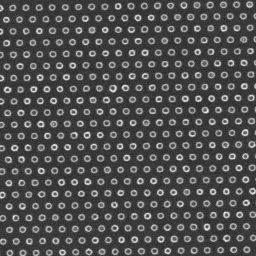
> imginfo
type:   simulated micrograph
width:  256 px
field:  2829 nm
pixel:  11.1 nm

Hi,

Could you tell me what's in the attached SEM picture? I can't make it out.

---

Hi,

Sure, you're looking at a regular array of raised bodies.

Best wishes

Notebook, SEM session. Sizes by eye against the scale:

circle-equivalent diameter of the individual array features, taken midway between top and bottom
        64.8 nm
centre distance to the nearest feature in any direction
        142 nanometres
